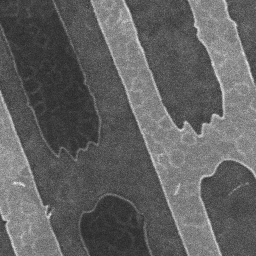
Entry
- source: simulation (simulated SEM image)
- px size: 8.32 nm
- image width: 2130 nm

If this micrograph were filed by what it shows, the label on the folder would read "one or a few lines or trenches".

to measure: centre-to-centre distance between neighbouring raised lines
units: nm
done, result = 678